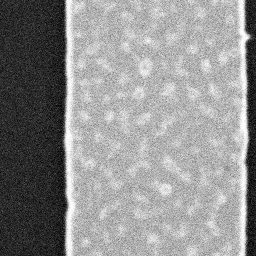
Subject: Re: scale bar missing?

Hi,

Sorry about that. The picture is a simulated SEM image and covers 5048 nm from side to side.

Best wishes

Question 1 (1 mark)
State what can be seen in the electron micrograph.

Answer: one or a few lines or trenches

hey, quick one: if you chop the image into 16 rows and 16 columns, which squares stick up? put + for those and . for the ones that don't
....+++++++++++.
....+++++++++++.
....+++++++++++.
....+++++++++++.
....+++++++++++.
....+++++++++++.
....+++++++++++.
....+++++++++++.
....+++++++++++.
....+++++++++++.
....+++++++++++.
....+++++++++++.
....+++++++++++.
....+++++++++++.
....+++++++++++.
....+++++++++++.